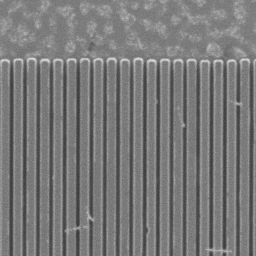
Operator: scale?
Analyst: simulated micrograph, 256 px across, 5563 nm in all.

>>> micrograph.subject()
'parallel lines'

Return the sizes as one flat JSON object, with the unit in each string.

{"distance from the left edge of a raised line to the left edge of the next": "290 nm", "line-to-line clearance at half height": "103 nm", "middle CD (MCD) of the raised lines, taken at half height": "0.19 µm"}